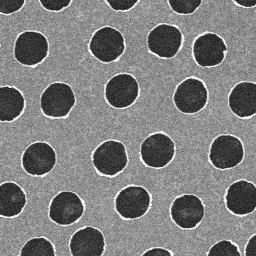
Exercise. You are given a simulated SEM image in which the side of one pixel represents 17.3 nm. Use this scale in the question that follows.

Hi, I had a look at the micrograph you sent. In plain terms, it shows a regular array of holes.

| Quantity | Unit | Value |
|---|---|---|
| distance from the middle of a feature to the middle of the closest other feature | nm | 862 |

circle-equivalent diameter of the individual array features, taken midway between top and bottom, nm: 592